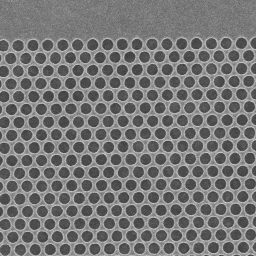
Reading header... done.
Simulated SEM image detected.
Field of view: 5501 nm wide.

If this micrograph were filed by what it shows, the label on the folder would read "a regular array of holes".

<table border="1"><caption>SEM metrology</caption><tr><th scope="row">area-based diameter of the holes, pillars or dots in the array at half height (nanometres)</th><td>247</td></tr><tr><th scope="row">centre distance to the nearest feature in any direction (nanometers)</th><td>310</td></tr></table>